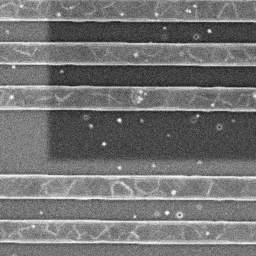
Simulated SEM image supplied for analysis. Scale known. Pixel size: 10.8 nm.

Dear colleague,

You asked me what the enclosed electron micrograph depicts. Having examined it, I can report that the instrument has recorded wiring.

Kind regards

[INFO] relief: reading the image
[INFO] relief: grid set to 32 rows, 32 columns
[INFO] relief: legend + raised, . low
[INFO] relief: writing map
++++++++++++++++++++++++++++++++
++++++++++++++++++++++++++++++++
.........+++++.+++++++++++++++++
................................
................................
++++++++++++++++..+.............
++++++++++++++++++++++++++++++++
++++++++++++++++++++++++++++++++
................................
................................
................................
++++++++++++++++++++++++++++++++
++++++++++++++++++++++++++++++++
++++++++++++++++++++++++++++++++
................................
................................
................................
................................
................................
................................
................................
................................
++++++++++++++++++++++++++++++++
++++++++++++++++++++++++++++++++
++++++++++++++++++++++++++++++++
................................
................................
................................
++++++++++++++++++++++++++++++++
++++++++++++++++++++++++++++++++
................................
................................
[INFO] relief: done